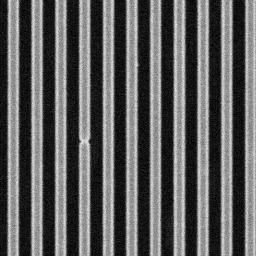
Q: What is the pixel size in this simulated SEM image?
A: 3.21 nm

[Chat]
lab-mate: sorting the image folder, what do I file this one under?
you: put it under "parallel lines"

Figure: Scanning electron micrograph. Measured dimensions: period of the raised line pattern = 76.3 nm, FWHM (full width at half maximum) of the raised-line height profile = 0.0285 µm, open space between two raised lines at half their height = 0.0482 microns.